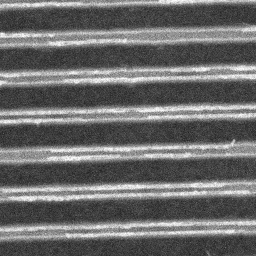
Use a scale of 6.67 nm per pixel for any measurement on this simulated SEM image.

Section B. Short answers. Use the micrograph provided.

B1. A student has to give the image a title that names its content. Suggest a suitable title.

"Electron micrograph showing parallel lines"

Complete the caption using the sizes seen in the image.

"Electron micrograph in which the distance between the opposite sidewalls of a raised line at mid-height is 0.0867 micrometres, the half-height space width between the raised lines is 0.168 um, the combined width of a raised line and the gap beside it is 257 nm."